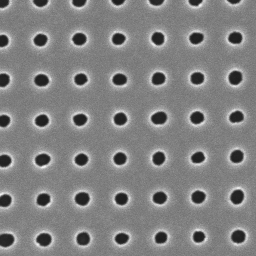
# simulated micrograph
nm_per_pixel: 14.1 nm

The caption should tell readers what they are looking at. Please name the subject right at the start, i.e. a regular array of holes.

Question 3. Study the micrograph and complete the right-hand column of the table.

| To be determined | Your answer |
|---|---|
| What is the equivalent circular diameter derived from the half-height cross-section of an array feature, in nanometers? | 199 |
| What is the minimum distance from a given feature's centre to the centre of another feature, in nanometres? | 549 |